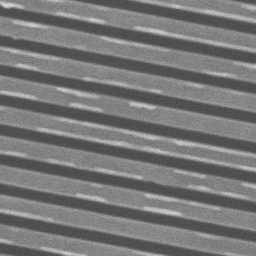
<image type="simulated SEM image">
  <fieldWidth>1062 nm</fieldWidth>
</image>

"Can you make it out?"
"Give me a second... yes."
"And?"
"parallel lines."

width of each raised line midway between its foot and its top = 17.1 px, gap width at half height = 49.5 nanometers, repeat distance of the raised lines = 121 nanometers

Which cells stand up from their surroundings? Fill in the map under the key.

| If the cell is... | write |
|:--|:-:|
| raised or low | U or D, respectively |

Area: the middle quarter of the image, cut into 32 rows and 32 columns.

UUUUUUUUUDDDDDDDDDDDDDDDDDDUUUUU
UUUUUUUUUUUUUUDDDDDDDDDDDDDDDDDD
UUUUUUUUUUUUUUUUUUUDDDDDDDDDDDDD
DDUUUUUUUUUUUUUUUUUUUUUUUDDDDDDD
DDDDDDDDDUUUUUUUUUUUUUUUUUUUUUDD
DDDDDDDDDDDDDDUUUUUUUUUUUUUUUUUU
UUDDDDDDDDDDDDDDDDDUUUUUUUUUUUUU
UUUUUUUDDDDDDDDDDDDDDDDDDUUUUUUU
UUUUUUUUUUUUDDDDDDDDDDDDDDDDDDUU
UUUUUUUUUUUUUUUUUDDDDDDDDDDDDDDD
DUUUUUUUUUUUUUUUUUUUUUUDDDDDDDDD
DDDDDDDUUUUUUUUUUUUUUUUUUUUUDDDD
DDDDDDDDDDDDUUUUUUUUUUUUUUUUUUUU
DDDDDDDDDDDDDDDDDUUUUUUUUUUUUUUU
UUUUUDDDDDDDDDDDDDDDDUDUUUUUUUUU
UUUUUUUUUUDDDDDDDDDDDDDDDDDUUUUU
UUUUUUUUUUUUUUUDDDDDDDDDDDDDDDDD
UUUUUUUUUUUUUUUUUUUUDDDDDDDDDDDD
DDDDUUUUUUUUUUUUUUUUUUUUUUDDDDDD
DDDDDDDDDUUUUUUUUUUUUUUUUUUUUUUD
DDDDDDDDDDDDDDUUUUUUUUUUUUUUUUUU
UUUDDDDDDDDDDDDDDDDUUUUUUUUUUUUU
UUUUUUUUDDDDDDDDDDDDDDDDDUUUUUUU
UUUUUUUUUUUUUDDDDDDDDDDDDDDDDDUU
UUUUUUUUUUUUUUUUUUUDDDDDDDDDDDDD
DDUUUUUUUUUUUUUUUUUUUUUUDDDDDDDD
DDDDDDDUUUUUUUUUUUUUUUUUUUUUUDDD
DDDDDDDDDDDDUUUUUUUUUUUUUUUUUUUU
DDDDDDDDDDDDDDDDDUUUUUUUUUUUUUUU
UUUUUDDDDDDDDDDDDDDDDDDUUUUUUUUU
UUUUUUUUUUUDDDDDDDDDDDDDDDDDUUUU
UUUUUUUUUUUUUUUUUDDDDDDDDDDDDDDD